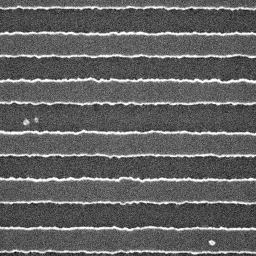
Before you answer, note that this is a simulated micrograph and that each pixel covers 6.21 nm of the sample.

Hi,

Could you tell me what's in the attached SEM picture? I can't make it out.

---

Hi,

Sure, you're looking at lines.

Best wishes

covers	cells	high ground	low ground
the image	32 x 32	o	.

oooooooooooooooooooooooooooooooo
................................
................................
................................
oooooooooooooooooooooooooooooooo
oooooooooooooooooooooooooooooooo
oooooooooooooooooooooooooooooooo
................................
................................
................................
oooooooooooooooooooooooooooooooo
oooooooooooooooooooooooooooooooo
oooooooooooooooooooooooooooooooo
................................
................................
................................
...ooo....oo......ooo.oo........
oooooooooooooooooooooooooooooooo
oooooooooooooooooooooooooooooooo
.....o.......oooo...oooooo.ooooo
................................
................................
oooooooooooooooooo.ooooo.ooo.ooo
oooooooooooooooooooooooooooooooo
oooooooooooooooooooooooooooooooo
...............o..............oo
................................
................................
oo..oo....o...o...oo....o.......
oooooooooooooooooooooooooooooooo
oooooooooooooooooooooooooooooooo
...o.o.....oooo.....oooooooooooo